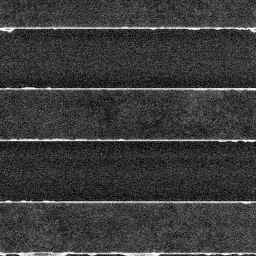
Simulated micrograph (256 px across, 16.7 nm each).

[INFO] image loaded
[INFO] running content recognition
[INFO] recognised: lines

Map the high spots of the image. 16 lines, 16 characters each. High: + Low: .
++++++++++++++++
++++++++++++++++
................
................
................
................
++++++++++++++++
++++++++++++++++
++++++++++++++++
................
................
................
................
++++++++++++++++
++++++++++++++++
++++++++++++++++